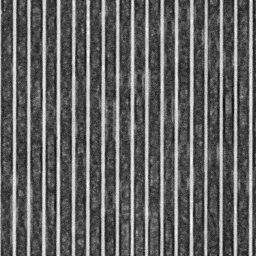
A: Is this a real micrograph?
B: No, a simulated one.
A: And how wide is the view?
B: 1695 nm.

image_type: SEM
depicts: parallel lines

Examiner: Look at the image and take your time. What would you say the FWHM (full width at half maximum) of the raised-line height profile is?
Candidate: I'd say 2.63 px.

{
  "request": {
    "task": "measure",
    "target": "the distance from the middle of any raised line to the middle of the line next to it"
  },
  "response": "0.0978 um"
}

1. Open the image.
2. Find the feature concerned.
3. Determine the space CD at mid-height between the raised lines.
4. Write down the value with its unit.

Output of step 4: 0.0836 um